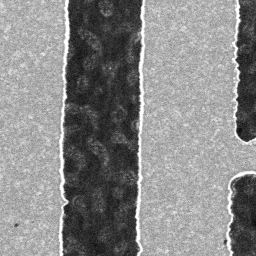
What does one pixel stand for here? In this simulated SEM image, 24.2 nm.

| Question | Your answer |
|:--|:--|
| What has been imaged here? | one or a few lines or trenches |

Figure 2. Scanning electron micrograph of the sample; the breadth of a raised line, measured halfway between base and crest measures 2250 nm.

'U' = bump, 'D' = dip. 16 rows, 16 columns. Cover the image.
UUUUDDDDDUUUUUUD
UUUUDDDDDUUUUUUD
UUUUDDDDDUUUUUUD
UUUUDDDDDUUUUUUD
UUUUDDDDDUUUUUUD
UUUUDDDDDUUUUUUD
UUUUDDDDDUUUUUUD
UUUUDDDDDUUUUUUD
UUUUDDDDDUUUUUUD
UUUUDDDDDUUUUUUU
UUUUDDDDDUUUUUUU
UUUUDDDDDUUUUUDD
UUUUDDDDDUUUUUDD
UUUUDDDDDUUUUUDD
UUUUDDDDDUUUUUDD
UUUUDDDDDUUUUUDD